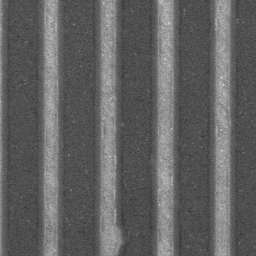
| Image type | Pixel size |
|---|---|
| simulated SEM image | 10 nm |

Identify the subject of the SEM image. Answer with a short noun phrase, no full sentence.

parallel lines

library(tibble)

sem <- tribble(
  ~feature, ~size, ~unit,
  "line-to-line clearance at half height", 0.394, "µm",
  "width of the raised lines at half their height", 0.183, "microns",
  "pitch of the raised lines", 574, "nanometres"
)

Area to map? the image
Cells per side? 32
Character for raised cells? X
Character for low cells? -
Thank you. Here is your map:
-----XX-----XXX-----XX-----XX---
-----XX-----XXX-----XX-----XX---
-----XX-----XXX-----XX-----XX---
-----XX-----XXX-----XX-----XX---
-----XX-----XXX-----XX-----XX---
-----XX-----XXX-----XX-----XX---
-----XX-----XXX-----XX-----XX---
-----XX-----XXX-----XX-----XX---
-----XX-----XXX-----XX-----XX---
-----XX------XX-----XX-----XX---
-----XX------XX-----XX-----XX---
-----XX------XX-----XX-----XX---
-----XX-----XXX-----XX-----XX---
-----XX-----XXX-----XX-----XX---
-----XX-----XXX-----XX-----XX---
-----XX-----XXX-----XX-----XX---
-----XX-----XXX-----XX-----XX---
-----XX-----XXX----XXX-----XX---
-----XX-----XXX----XXX-----XX---
-----XX-----XXX----XXX-----XX---
-----XX-----XXX----XXX-----XX---
-----XX-----XXX----XXX-----XX---
-----XX-----XXX----XXX-----XX---
-----XX-----XXX----XXX-----XX---
-----XX-----XXX----XXX-----XX---
-----XX-----XXX----XXX-----XX---
-----XX-----XXX----XXX-----XX---
-----XX-----XXX----XXX-----XX---
-----XX-----XXX----XXX-----XX---
-----XX-----XXX-----XX-----XX---
-----XX-----XXX----XXX-----XX---
-----XX-----XXX----XXX-----XX---